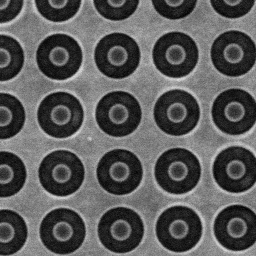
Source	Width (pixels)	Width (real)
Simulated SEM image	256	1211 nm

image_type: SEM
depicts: an array of small figures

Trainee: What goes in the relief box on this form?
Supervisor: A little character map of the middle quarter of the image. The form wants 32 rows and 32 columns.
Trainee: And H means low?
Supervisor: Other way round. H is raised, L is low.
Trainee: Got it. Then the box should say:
LLLLHHHHLLLLLLLLLLLHHHHLLLLLLLLL
LLLLHHHHHLLLLLLLLLHHHHHLLLLLLLLL
LLLHHHHHHHLLLLLLLHHHHHHHHLLLLLLL
LLHHHHHHHHHHLLLHHHHHHHHHHHLLLLHH
HHHHHHHHHHHHHHHHHHHHHHHHHHHHHHHH
HHHHHHHHHHHHHHHHHHHHHHHHHHHHHHHH
HHHHHHHHHHHHHHHHHHHHHHHHHHLLLLLH
LLHHHHHHHHHLLLLLLHHHHHHHLLLLLLLL
LLLHHHHHHLLLLLLLLLHHHHHLLLLLLLLL
LLLLHHHHHLLLLLLLLLLHHHHLLLLLLLLL
LLLLLHHHLLLLHHHLLLLHHHHLLLLHHHLL
HLLLLHHHLLLHHHHHLLLHHHLLLLHHHHLL
HLLLLHHHLLLHHHHHLLLHHHLLLLHHHHLL
HLLLLHHHLLLLHHHHLLLHHHLLLLHHHHLL
LLLLLHHHLLLLHHHLLLLHHHHLLLLLLLLL
LLLLLHHHLLLLLLLLLLLHHHHLLLLLLLLL
LLLLHHHHHLLLLLLLLLHHHHHHLLLLLLLL
LLLHHHHHHHHLLLLLLHHHHHHHHHLLLLLH
LHHHHHHHHHHHHHHHHHHHHHHHHHHHHHHH
HHHHHHHHHHHHHHHHHHHHHHHHHHHHHHHH
HHHHHHHHHHHHHHHHHHHHHHHHHHHHHHHH
LHHHHHHHHHHHLLLLHHHHHHHHHHLLLLLH
LLLHHHHHHHLLLLLLLHHHHHHHLLLLLLLL
LLLLHHHHHLLLLLLLLLHHHHHLLLLLLLLL
LLLLLHHHHLLLLLLLLLLHHHHLLLLLLLLL
LLLLLHHHLLLLHHHHLLLLHHHLLLLHHHLL
HLLLLHHHLLLLHHHHLLLLHHLLLLHHHHHL
HLLLLHHHLLLLHHHHLLLLHHLLLLHHHHHL
HLLLLHHHLLLLHHHLLLLLHHHLLLLHHHLL
LLLLLHHHLLLLLLLLLLLLHHHLLLLLLLLL
LLLLHHHHHLLLLLLLLLLHHHHLLLLLLLLL
LLLLHHHHHHLLLLLLLLHHHHHHLLLLLLLL